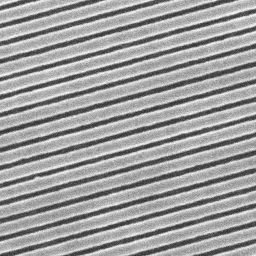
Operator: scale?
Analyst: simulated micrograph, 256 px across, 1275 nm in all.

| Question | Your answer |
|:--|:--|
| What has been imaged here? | parallel lines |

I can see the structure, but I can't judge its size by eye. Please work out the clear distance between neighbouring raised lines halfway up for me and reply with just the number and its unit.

32.4 nanometers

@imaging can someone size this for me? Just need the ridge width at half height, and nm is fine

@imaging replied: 55.9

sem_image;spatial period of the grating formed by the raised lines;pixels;17.1